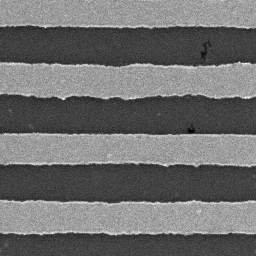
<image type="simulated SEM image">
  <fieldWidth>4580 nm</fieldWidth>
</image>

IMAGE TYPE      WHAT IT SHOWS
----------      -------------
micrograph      one or a few lines or trenches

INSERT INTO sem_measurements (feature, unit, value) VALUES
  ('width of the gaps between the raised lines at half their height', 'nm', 696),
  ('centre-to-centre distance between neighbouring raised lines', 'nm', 1220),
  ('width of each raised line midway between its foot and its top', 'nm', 535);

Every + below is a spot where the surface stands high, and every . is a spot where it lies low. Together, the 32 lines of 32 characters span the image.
++++++++++++++++++++++++++++++++
++++++++++++++++++++++++++++++++
++++++++++++++++++++++++++++++++
................................
................................
................................
................................
................................
++++++++++++++++++++++++++++++++
++++++++++++++++++++++++++++++++
++++++++++++++++++++++++++++++++
++++++++++++++++++++++++++++++++
................................
................................
................................
................................
................................
++++++++++++++++++++++++++++++++
++++++++++++++++++++++++++++++++
++++++++++++++++++++++++++++++++
+...................++..+...++++
................................
................................
................................
................................
+++++++++++++..+++++++++++++++++
++++++++++++++++++++++++++++++++
++++++++++++++++++++++++++++++++
++++++++++++++++++++++++++++++++
................................
................................
................................